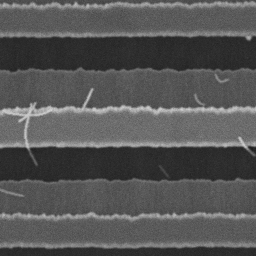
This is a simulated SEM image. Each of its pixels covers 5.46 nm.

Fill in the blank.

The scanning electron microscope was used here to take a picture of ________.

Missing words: lines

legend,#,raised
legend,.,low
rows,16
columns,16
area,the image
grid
################
################
................
................
################
################
################
################
################
................
................
################
################
################
################
..##..###..#....